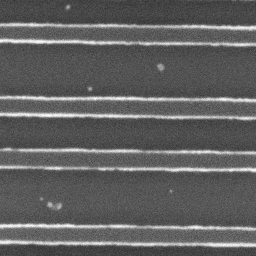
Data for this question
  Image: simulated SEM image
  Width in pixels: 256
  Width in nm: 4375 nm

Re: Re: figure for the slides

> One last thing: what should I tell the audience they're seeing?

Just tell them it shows lines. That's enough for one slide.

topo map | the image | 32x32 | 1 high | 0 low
00000000000000000000000000000000
00000000000000000000000000000000
00000000000000000000000000000000
11111111111111111111111111111110
11111111111111111111111111111111
00000000000000000000000000011111
00000000000000000000000000000000
00000000000000000000000000000000
00000000000000000000000000000000
00000000000000000000000000000000
00000000000000000000000000000000
00000000000000000000000000000000
11111111111111111111111111111000
11111111111111111111111111111111
00000000000000111111111111111111
00000000000000000000000000000000
00000000000000000000000000000000
00000000000000000000000000000000
00000000000000000000000000000000
11111111111111111111111111111111
11111111111111111111111111111111
00000000000000000000000000000000
00000000000000000000000000000000
00000000000000000000000000000000
00000000000000000000000000000000
00000000000000000000000000000000
00000000000000000000000000000000
00000000000000000000000000000000
11111111111111111111111110000000
11111111111111111111111111111111
00000000000000011101111111111111
00000000000000000000000000000000